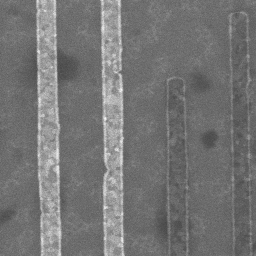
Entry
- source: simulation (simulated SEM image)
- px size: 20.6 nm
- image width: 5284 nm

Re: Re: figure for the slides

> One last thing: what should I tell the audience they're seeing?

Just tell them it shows parallel lines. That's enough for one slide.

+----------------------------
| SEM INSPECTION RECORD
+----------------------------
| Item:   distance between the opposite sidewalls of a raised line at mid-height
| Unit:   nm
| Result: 346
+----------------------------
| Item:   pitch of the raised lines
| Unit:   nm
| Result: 1320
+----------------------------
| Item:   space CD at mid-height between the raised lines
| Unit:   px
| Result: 47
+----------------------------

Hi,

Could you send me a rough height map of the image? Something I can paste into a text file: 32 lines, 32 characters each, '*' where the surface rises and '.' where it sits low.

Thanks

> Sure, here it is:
.....**......**.................
.....**......**.................
.....**......**..............**.
.....**......**..............**.
.....**......**..............**.
.....**......**..............**.
.....**......**..............**.
.....**......**..............**.
.....**......**..............**.
.....**......**..............**.
.....**......**......**......**.
.....**......**......**......**.
.....**......**......**......**.
.....**......**......**......**.
.....**......**......**......**.
.....**......**......**......**.
.....**......**......**......**.
.....**......**......**......**.
.....**......**......**......**.
.....**......**......**......**.
.....**......**......**......**.
.....**......**......**......**.
.....**......**......**......**.
.....**......**......**......**.
.....**......**......**......**.
.....**......**......**......**.
.....**......**......**......**.
.....**......**......**......**.
.....**......**......**......**.
.....**......**......**......**.
.....**......**......**......**.
.....**......**......**......**.